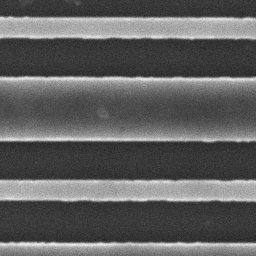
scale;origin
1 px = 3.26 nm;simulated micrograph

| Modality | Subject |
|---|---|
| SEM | lines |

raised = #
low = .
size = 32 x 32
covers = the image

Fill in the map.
................................
................................
################################
################################
################################
................................
................................
................................
................................
................................
################################
################################
################################
################################
################################
################################
################################
################################
................................
................................
................................
................................
................................
################################
################################
................................
................................
................................
................................
................................
################################
################################